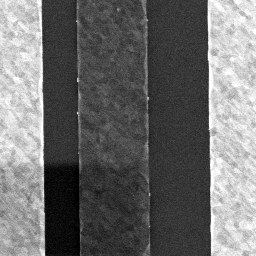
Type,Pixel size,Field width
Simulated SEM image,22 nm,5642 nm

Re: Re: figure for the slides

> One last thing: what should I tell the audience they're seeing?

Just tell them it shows wiring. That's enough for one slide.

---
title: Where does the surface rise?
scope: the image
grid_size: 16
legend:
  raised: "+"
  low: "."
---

++...++++....+++
+++..++++....+++
+++..++++....+++
+++..++++....+++
+++..++++....+++
+++..++++....+++
+++..++++....+++
+++..++++....+++
+++..++++....+++
+++..++++....+++
+++..++++....+++
+++..++++....+++
+++..++++....+++
+++..++++....+++
+++..++++....+++
+++..++++....+++